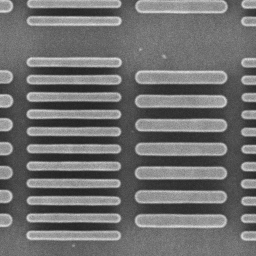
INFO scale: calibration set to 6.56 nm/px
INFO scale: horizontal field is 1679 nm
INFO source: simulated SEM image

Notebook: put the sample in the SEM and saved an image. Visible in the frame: groups of lines, slits or small figures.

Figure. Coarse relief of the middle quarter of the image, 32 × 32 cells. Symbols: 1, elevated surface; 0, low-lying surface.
11111111111111000000000000000000
00000000000000000000000000000000
00000000000000000011111111111111
11111111111111000011111111111111
11111111111111000011111111111111
00000000000000000000000000000000
00000000000000000000000000000000
11111111111111000000000000000000
11111111111111000011111111111111
00000000000000000011111111111111
00000000000000000011111111111111
00000000000000000000000000000000
11111111111111000000000000000000
00001111111111000000000000000000
00000000000000000011111111111111
00000000000000000011111111111111
11111111111111000001111111111111
11111111111111000000000000000000
00000000000000000000000000000000
00000000000000000000000000000000
11111111111111000011111111111111
11111111111111000011111111111111
00000000000000000001111111111111
00000000000000000000000000000000
11111111111110000000000000000000
11111111111111000000000000000000
11111111111111000011111111111111
00000000000000000011111111111111
00000000000000000011111111111111
11111111111111000000000000000000
11111111111111000000000000000000
00000000000000000000000000000000